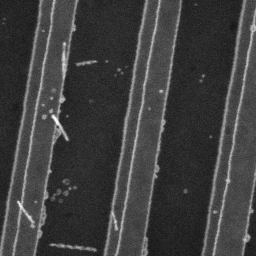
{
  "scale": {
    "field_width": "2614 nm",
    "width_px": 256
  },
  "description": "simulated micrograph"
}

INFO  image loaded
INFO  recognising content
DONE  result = lines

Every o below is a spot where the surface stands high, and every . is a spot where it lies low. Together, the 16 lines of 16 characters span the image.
...oo....oo....o
..ooo....oo....o
..oo.....oo....o
..oo.....oo....o
..oo....ooo....o
..oo....oo....oo
..oo....oo....oo
.ooo....oo....oo
.ooo....oo....oo
.oo.....oo....oo
.oo....ooo....oo
.oo....ooo...ooo
.oo....oo....ooo
ooo....oo....ooo
ooo....oo....oo.
oo.....oo....oo.